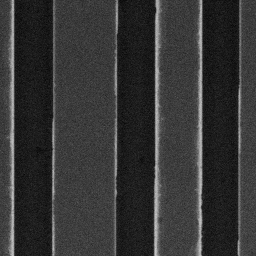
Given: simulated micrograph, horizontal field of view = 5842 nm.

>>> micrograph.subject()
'lines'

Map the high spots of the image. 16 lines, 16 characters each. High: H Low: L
HLLHHHHLLLHHHLLH
HLLHHHHLLLHHHLLH
HLLHHHHLLLHHHLLH
HLLHHHHLLLHHHLLH
HLLHHHHLLLHHHLLH
HLLHHHHLLLHHHLLH
HLLHHHHLLLHHHLLH
HLLHHHHLLLHHHLLH
HLLHHHHLLLHHHLLH
HLLHHHHLLLHHHLLH
HLLHHHHLLLHHHLLH
HLLHHHHLLLHHHLLH
HLLHHHHLLLHHHLLH
HLLHHHHLLLHHHLLH
HLLHHHHLLLHHHLLH
HLLHHHHLLLHHHLLH